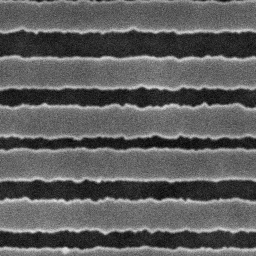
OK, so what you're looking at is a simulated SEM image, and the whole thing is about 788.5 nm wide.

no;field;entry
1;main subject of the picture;lines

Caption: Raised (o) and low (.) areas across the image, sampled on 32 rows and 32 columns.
oooooooooooooooooooooooooooooooo
oooooooooooooooooooooooooooooooo
oooooooooooooooooooooooooooooooo
oooooooooooooooooooooooooooooooo
................................
................................
................................
oooooooooooooooooooooooooooooooo
oooooooooooooooooooooooooooooooo
oooooooooooooooooooooooooooooooo
oooooooooooooooooooooooooooooooo
................................
................................
oooooooooooooooooooooooooooooooo
oooooooooooooooooooooooooooooooo
oooooooooooooooooooooooooooooooo
oooooooooooooooooooooooooooooooo
................................
..........o..o.....o............
oooooooooooooooooooooooooooooooo
oooooooooooooooooooooooooooooooo
oooooooooooooooooooooooooooooooo
oooo.ooooo.ooooooooooooooooo...o
................................
................................
oooooooooooooooooooooooooooooooo
oooooooooooooooooooooooooooooooo
oooooooooooooooooooooooooooooooo
oooooooooooooooooooooooooooooooo
................................
................................
oooooooooooooooooooooooooooooooo